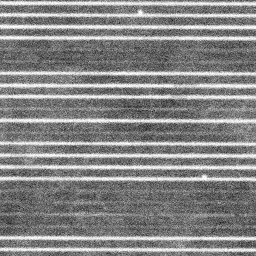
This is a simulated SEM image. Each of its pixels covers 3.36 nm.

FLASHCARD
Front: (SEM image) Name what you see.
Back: parallel lines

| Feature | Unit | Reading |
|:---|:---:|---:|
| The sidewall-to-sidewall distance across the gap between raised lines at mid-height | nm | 31.5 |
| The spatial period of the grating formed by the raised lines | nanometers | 39.4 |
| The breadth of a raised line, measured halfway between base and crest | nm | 7.6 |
